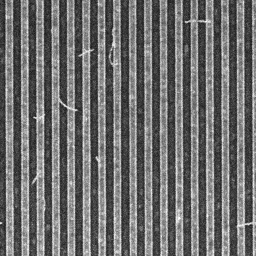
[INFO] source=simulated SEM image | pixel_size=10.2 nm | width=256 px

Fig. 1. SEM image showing parallel lines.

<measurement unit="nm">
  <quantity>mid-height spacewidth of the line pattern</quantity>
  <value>95.7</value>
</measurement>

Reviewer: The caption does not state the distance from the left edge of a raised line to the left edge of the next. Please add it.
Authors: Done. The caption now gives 157 nanometres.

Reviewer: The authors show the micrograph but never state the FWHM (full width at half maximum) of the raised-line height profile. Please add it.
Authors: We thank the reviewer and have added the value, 61.2 nm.